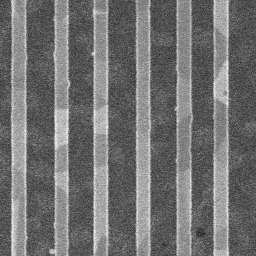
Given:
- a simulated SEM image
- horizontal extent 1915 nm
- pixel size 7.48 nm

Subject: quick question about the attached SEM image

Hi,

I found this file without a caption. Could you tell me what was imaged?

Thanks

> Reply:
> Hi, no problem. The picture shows parallel lines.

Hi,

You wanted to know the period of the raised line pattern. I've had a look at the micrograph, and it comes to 302 nm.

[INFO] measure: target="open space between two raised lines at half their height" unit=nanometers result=208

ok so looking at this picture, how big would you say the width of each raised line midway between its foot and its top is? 98.2 nm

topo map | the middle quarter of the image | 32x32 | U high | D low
UDDDDDDDUUUDDDDDDDUUUDDDDDDDUUUU
UDDDDDDDUUUDDDDDDDUUUDDDDDDDUUUU
UDDDDDDDUUUDDDDDDDUUUDDDDDDDUUUU
UDDDDDDDUUUDDDDDDDUUUDDDDDDDDUUU
UDDDDDDDUUUDDDDDDDUUUDDDDDDDDUUU
UDDDDDDDUUUDDDDDDDUUUDDDDDDDUUUU
UDDDDDDDUUUDDDDDDDUUUDDDDDDDUUUU
UDDDDDDDUUUDDDDDDDUUUDDDDDDDUUUU
UDDDDDDDUUUDDDDDDDUUUDDDDDDDUUUU
UDDDDDDDUUUDDDDDDDUUUDDDDDDDUUUU
UDDDDDDDUUUDDDDDDDUUUDDDDDDDUUUU
UDDDDDDDUUUDDDDDDDUUUDDDDDDDUUUU
UDDDDDDDUUUDDDDDDDUUUDDDDDDDUUUU
UDDDDDDDUUUDDDDDDDUUUDDDDDDDUUUU
UDDDDDDDUUUDDDDDDDUUUDDDDDDDUUUU
UDDDDDDDUUUDDDDDDDUUUDDDDDDDUUUU
UDDDDDDDUUUDDDDDDDUUUDDDDDDDUUUU
UDDDDDDDUUUDDDDDDDUUUDDDDDDDUUUU
UDDDDDDDUUUDDDDDDDUUUDDDDDDDUUUU
UDDDDDDDUUUDDDDDDDUUUDDDDDDDUUUU
UDDDDDDDUUUDDDDDDDUUUDDDDDDDUUUU
UDDDDDDDUUUDDDDDDDUUUDDDDDDDUUUD
UDDDDDDDUUUDDDDDDDUUUDDDDDDDUUUU
UDDDDDDDUUUDDDDDDDUUUDDDDDDDUUUU
UDDDDDDDUUUDDDDDDDUUUDDDDDDDUUUU
UDDDDDDDUUUDDDDDDDUUUDDDDDDDUUUU
UDDDDDDDUUUDDDDDDDUUUDDDDDDDUUUU
UDDDDDDDUUUDDDDDDDUUUDDDDDDDUUUU
UDDDDDDDUUUDDDDDDDUUUDDDDDDDUUUU
UDDDDDDDUUUDDDDDDDUUUDDDDDDDUUUU
UDDDDDDDUUUDDDDDDDUUUDDDDDDDUUUU
UDDDDDDDUUUDDDDDDDUUUDDDDDDDUUUU